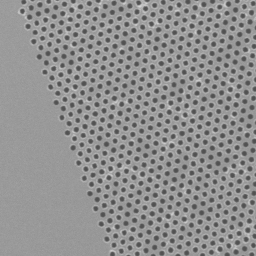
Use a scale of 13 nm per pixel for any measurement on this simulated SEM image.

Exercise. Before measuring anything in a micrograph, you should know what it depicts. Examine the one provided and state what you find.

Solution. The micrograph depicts a regular array of holes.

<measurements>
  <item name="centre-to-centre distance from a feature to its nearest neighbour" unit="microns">0.119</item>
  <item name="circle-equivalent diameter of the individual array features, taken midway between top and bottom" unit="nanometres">68.8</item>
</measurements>